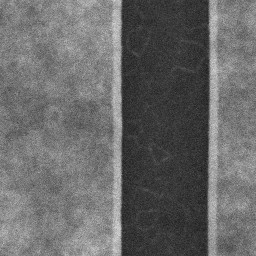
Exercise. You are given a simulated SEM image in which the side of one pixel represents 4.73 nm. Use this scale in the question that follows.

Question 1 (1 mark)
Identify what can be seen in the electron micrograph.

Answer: one or a few lines or trenches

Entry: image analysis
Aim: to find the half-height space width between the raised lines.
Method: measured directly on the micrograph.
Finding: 449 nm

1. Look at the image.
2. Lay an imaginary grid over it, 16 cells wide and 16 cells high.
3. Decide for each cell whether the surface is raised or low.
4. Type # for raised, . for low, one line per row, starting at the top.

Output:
#######......###
#######......###
#######......###
#######......###
#######......###
#######......###
#######......###
#######......###
#######......###
#######......###
#######......###
#######......###
#######......###
#######......###
#######......###
#######......###